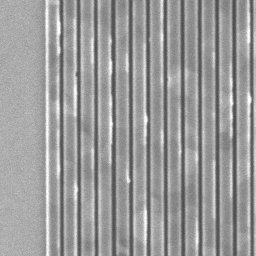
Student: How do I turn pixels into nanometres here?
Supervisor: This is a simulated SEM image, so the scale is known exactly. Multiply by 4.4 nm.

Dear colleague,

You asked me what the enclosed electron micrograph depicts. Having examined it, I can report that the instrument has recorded parallel lines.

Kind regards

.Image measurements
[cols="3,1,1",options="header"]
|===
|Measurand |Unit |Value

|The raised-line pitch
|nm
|76.1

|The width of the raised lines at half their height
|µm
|0.0534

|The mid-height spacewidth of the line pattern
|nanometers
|24.2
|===